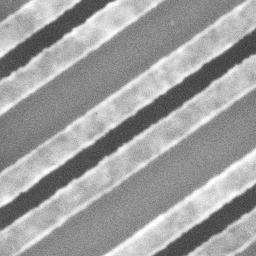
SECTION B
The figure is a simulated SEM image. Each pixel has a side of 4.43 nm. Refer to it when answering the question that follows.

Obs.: lines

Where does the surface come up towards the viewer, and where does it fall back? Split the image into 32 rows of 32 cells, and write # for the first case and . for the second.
...######.....######..........##
..######....######...........###
.######....######..........#####
#####.....#####...........######
####....######...........######.
##.....######..........######...
#....######...........######....
....######..........######.....#
...#####...........######....###
.######..........######.....####
######..........######....######
####...........######....######.
###..........######.....######..
#...........######....######....
..........######.....######.....
.........######....######.......
........#####.....######........
......######....#######.........
.....######....######...........
...######.....######...........#
..######....######...........###
######.....######...........####
#####....#######...........#####
####....######...........######.
##.....######...........######..
#....######...........######....
....######...........######....#
..######...........#######....##
.######...........######....####
######...........######....#####
####...........######....######.
###...........######....######..